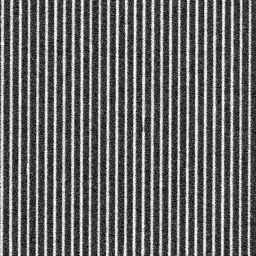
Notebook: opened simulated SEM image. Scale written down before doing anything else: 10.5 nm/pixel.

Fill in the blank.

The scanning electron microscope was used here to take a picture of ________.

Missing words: parallel lines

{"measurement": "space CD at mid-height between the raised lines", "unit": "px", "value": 7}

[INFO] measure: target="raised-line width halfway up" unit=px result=1.88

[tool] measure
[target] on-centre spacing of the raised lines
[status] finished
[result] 93.1 nanometers